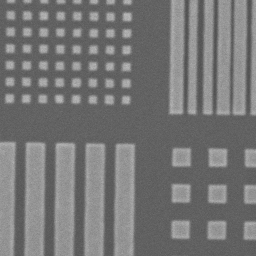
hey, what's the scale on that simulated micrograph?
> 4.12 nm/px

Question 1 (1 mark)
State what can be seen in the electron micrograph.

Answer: groups of lines, slits or small figures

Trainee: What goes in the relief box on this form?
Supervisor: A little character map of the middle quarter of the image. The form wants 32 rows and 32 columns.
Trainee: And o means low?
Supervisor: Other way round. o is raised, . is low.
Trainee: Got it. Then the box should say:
..oo..oo...o...oo..........ooo.o
...............oo..........ooo.o
...........................ooo.o
...........................ooo.o
..oo..oo..oo...oo..........ooo.o
..oo..oo..oo...oo..........ooo.o
...........................ooo.o
...........................ooo.o
..oo..oo..oo...o...........ooo.o
..oo..oo..oo...o...........ooo.o
...........................ooo.o
..........................oooo.o
................................
................................
................................
................................
................................
................................
................................
................................
oo....oooo...oooo...............
oo....oooo...oooo..........oooo.
oo....oooo...oooo..........oooo.
oo....oooo...oooo..........oooo.
oo....oooo...oooo..........oooo.
oo....oooo...oooo..........oo...
oo....oooo...oooo...............
oo....oooo...oooo...............
oo....oooo...oooo...............
oo...ooooo...oooo...............
oo...ooooo...oooo..........oooo.
oo...ooooo...oooo..........oooo.